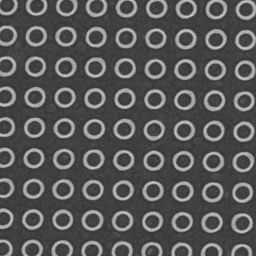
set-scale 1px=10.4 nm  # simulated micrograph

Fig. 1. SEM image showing a regular array of ring-shaped raised bodies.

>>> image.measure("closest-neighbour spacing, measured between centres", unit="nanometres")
310